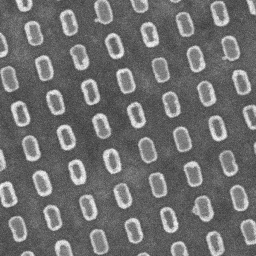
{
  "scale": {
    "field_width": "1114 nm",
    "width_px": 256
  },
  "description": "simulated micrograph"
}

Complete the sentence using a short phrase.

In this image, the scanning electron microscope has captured a regular array of raised bodies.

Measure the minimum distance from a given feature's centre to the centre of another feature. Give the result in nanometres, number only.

158